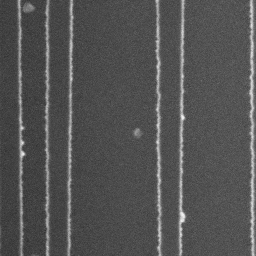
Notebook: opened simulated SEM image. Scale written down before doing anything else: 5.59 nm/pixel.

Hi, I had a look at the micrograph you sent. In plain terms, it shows lines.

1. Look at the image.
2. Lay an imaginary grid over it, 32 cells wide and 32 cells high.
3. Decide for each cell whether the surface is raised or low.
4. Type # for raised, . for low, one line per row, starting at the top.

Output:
##....###...........###........#
##....###...........###........#
###...###...........###........#
###...###...........###........#
###...###...........###........#
###...###...........###........#
###...###...........###........#
##....###...........###........#
###...###...........###........#
###...###...........###........#
###...###...........###........#
###...###...........###........#
###...###...........###........#
###...###...........###........#
###...###...........###........#
###...###...........###.........
###...###...........###........#
###...###...........###........#
###...###...........###........#
###...###...........###.........
###...###...........###.........
###...###...........###.........
###...###...........###.........
###...###...........###.........
###...###...........###.........
###...###...........###........#
###...###...........###........#
###...###...........###.........
###...###...........###.........
###...###...........###.........
###...###...........###.........
###...###...........###.........